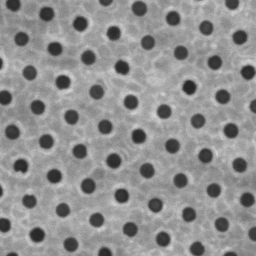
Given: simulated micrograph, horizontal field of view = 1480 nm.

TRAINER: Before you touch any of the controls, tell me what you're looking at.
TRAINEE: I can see a regular array of holes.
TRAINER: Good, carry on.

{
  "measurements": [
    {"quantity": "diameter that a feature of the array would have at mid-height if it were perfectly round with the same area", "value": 91.3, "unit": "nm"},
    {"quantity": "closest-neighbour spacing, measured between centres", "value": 0.2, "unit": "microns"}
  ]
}